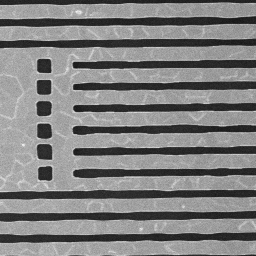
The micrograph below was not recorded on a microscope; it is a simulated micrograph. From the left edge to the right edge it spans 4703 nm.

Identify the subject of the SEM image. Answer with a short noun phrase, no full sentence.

groups of lines, slits or small figures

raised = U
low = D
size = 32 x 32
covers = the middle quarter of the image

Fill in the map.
UUDDDDDDDDDDDDDDDDDDDDDDDDDDDDDD
UUUUUUUUDDUUUUUUUUUUUUUUUUUUUUUU
UUUUUUUUUUUUUUUUUUUUUUUUUUUUUUUU
UUUUUUUUUUUUUUUUUUUUUUUUUUUUUUUU
UUUUUUDDUUUUUDDDDDDUUUUUUUUDDDDD
UUDDDDDDDDDDDDDDDDDDDDDDDDDDDDDD
UUUDDDDDDDDDDDDDDDDDDDDDDUUUUUUD
UUUUUUUUUUUUUUUUUUUUUUUUUUUUUUUU
UUUUUUUUUUUUUUUUUUUUUUUUUUUUUUUU
UUUUUUUUUUUUUUUUUUUUUUUUUUUUUUUU
UUDDDDDDDDDDDDDDDDDDDDDDDDDDDDDD
UUDDDDDDDDDDDDDDDDDDDDDDDDDDDDDD
UUUUUUUUUUUUUUUUUUUUUUUUUUUUUUUU
UUUUUUUUUUUUUUUUUUUUUUUUUUUUUUUU
UUUUUUUUUUUUUUUUUUUUUUUUUUUUUUUU
UUUDDDDDDDDDDDDDDDDDDDDDDDDDDDDD
UUDDDDDDDDDDDDDDDDDDDDDDDDDDDDDD
UUUDDDDUUUUUUUUUUUUUUDDUUUUUUUUU
UUUUUUUUUUUUUUUUUUUUUUUUUUUUUUUU
UUUUUUUUUUUUUUUUUUUUUUUUUUUUUUUU
UUUUUUUUUUUUUUUUUUUUUUUUUUUUUUUU
UUDDDDDDDDDDDDDDDDDDDDDDDDDDDDDD
UUDDDDDDDDDDDDDDDDDDDDDDDDDDDDDD
UUUUUUUUUUUUUUUUUUUUUUUUUUUUUUUU
UUUUUUUUUUUUUUUUUUUUUUUUUUUUUUUU
UUUUUUUUUUUUUUUUUUUUUUUUUUUUUUUU
UUUDDDDDDDDDDDDDDDDDDDDDDDDDDDDD
UUDDDDDDDDDDDDDDDDDDDDDDDDDDDDDD
UUUUUDDUUUUUUUUUUUUUUUUUUUUUUUUU
UUUUUUUUUUUUUUUUUUUUUUUUUUUUUUUU
UUUUUUUUUUUUUUUUUUUUUUUUUUUUUUUU
UUUUUUUDDDDDDDDDDDDDDDDDUUUUDDDD